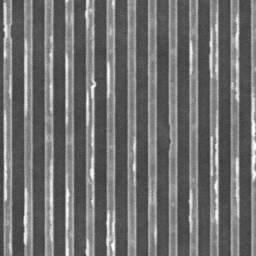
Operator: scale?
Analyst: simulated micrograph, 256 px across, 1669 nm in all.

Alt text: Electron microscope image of parallel lines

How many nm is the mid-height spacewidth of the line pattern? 86.3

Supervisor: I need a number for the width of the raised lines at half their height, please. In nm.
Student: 49.7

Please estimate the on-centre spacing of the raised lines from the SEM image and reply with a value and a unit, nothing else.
135 nm